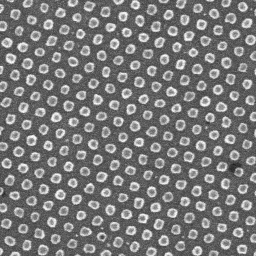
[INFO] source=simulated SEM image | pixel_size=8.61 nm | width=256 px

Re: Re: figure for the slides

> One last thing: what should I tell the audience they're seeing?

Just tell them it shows a regular array of raised bodies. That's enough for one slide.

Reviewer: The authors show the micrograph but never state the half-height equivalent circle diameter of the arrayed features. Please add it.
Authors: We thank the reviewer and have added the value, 0.0759 micrometres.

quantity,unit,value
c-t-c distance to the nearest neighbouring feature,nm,141